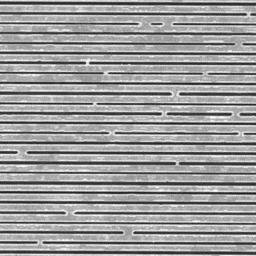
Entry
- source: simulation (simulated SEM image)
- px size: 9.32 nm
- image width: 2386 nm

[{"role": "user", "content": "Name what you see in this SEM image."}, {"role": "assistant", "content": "parallel lines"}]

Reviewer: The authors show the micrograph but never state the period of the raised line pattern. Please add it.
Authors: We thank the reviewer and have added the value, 92.8 nm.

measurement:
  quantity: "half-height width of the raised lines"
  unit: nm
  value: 66.4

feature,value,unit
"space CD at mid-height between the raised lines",25.6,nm